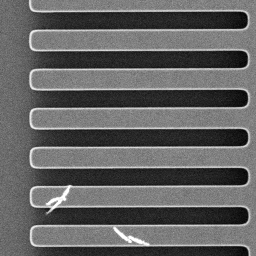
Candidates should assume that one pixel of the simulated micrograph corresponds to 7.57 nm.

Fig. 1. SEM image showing groups of lines, slits or small figures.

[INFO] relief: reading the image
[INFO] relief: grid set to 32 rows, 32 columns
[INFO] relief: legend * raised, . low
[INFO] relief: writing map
....****************************
..............................**
...............................*
..............................**
....****************************
....****************************
...............................*
...............................*
..............................**
....****************************
....****************************
...............................*
...............................*
.............*******************
....****************************
....****************************
...............................*
...............................*
....****************************
....****************************
....****************************
...............................*
...............................*
....****************************
....****************************
....****************************
...............................*
...............................*
....****************************
....****************************
....****************************
...............................*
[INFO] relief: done